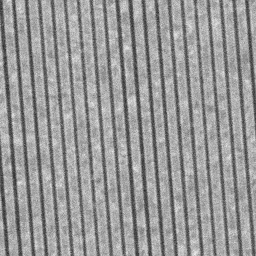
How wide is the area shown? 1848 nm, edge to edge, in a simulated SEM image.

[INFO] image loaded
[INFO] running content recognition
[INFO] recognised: parallel lines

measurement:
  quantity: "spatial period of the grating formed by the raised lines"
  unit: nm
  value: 93.4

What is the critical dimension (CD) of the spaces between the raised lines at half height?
33.3 nanometers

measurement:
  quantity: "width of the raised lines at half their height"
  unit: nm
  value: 59.4